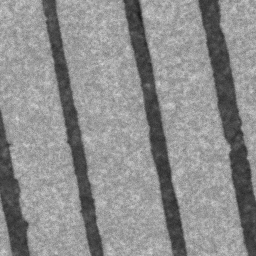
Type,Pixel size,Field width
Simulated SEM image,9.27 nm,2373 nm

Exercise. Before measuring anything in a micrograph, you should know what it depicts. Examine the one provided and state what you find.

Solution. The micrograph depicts one or a few lines or trenches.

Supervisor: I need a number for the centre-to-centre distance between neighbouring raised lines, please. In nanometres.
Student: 716